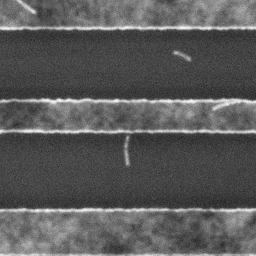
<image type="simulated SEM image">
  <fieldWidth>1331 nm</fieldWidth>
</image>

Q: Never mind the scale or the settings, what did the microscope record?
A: lines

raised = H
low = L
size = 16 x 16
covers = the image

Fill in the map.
HHHHHHHHHHHHHHHH
HHHHHHHHHHHHHHHH
LLLLLLLLLLLLLLLL
LLLLLLLLLLLLLLLL
LLLLLLLLLLLLLLLL
LLLLLLLLLLLLLLLL
HHHHHHHHHHHHHHHH
HHHHHHHHHHHHHHHH
LLLLLLLLLLLLLLLL
LLLLLLLLLLLLLLLL
LLLLLLLLLLLLLLLL
LLLLLLLLLLLLLLLL
LLLLLLLLLLLLLLLL
HHHHHHHHHHHHHHHH
HHHHHHHHHHHHHHHH
HHHHHHHHHHHHHHHH